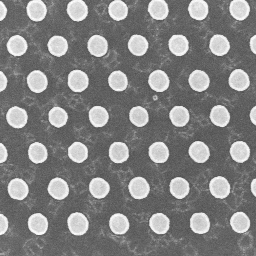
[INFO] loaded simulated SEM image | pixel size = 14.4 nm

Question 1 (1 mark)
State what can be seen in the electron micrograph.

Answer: a regular array of raised bodies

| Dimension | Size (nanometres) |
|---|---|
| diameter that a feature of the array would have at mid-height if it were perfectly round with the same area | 278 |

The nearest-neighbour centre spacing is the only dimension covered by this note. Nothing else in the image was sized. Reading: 578 nm